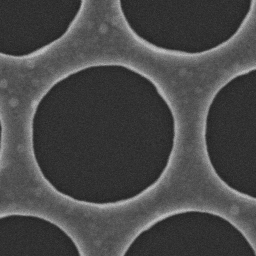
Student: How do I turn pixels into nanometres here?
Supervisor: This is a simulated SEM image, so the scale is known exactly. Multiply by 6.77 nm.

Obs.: holes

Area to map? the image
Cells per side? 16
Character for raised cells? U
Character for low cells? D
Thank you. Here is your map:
DDDDDUUUDDDDDDDD
DDDDDUUUDDDDDDDU
DDDDUUUUUDDDDDUU
UUUUUUUUUUUUUUUU
UUUUUDDDDUUUUUUU
UUUDDDDDDDUUUUDD
UUDDDDDDDDDUUDDD
UUDDDDDDDDDUUDDD
UUDDDDDDDDDUUDDD
UUDDDDDDDDDUUDDD
UUDDDDDDDDUUUDDD
UUUDDDDDDDUUUUDD
UUUUUDDDUUUUUUUU
DDUUUUUUUUUDDDUU
DDDDUUUUUDDDDDDU
DDDDDUUUDDDDDDDD